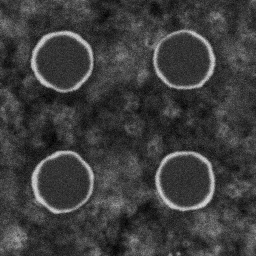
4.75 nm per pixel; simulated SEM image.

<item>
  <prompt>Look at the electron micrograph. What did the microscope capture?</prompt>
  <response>raised bodies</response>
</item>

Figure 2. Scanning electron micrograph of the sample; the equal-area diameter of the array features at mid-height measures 0.279 micrometres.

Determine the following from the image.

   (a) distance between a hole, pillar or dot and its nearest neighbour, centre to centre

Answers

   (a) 574 nanometers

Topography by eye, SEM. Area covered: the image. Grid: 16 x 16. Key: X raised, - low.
----------------
----------------
---XX-----XXX---
--XXXX----XXX---
--XXXX----XXX---
---XX------X----
----------------
----------------
----------------
----------------
--XXXX----XXX---
--XXXX----XXX---
---XX-----XXX---
----------------
----------------
----------------